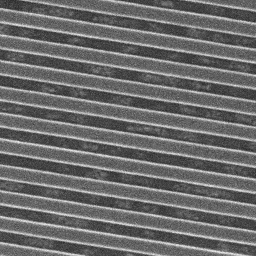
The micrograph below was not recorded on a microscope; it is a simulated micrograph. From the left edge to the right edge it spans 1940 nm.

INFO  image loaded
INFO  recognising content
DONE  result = parallel lines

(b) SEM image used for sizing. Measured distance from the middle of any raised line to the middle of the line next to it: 0.195 micrometres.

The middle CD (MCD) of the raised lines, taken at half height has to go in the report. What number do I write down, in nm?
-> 106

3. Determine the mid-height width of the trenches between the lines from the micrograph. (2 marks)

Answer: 11.3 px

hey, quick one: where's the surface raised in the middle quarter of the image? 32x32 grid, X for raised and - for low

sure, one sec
------------XXXXXXXXXXXXXXXXXXXX
------------------XXXXXXXXXXXXXX
XXXXX-------------------XXXXXXXX
XXXXXXXXXXXX------------------XX
XXXXXXXXXXXXXXXXXX--------------
--XXXXXXXXXXXXXXXXXXXXXX--------
---------XXXXXXXXXXXXXXXXXXXXX--
---------------XXXXXXXXXXXXXXXXX
XX------------------XXXXXXXXXXXX
XXXXXXXX--------------------XXXX
XXXXXXXXXXXXXX------------------
XXXXXXXXXXXXXXXXXXXX------------
-----XXXXXXXXXXXXXXXXXXXXXX-----
------------XXXXXXXXXXXXXXXXXXXX
------------------XXXXXXXXXXXXXX
XXXX--------------------XXXXXXXX
XXXXXXXXXX---------------------X
XXXXXXXXXXXXXXXXX---------------
--XXXXXXXXXXXXXXXXXXXXX---------
--------XXXXXXXXXXXXXXXXXXXXX---
--------------XXXXXXXXXXXXXXXXXX
XX-------------------XXXXXXXXXXX
XXXXXXXX-------------------XXXXX
XXXXXXXXXXXXXX------------------
XXXXXXXXXXXXXXXXXXXXX-----------
------XXXXXXXXXXXXXXXXXXXXX-----
-----------XXXXXXXXXXXXXXXXXXXXX
------------------XXXXXXXXXXXXXX
XXXX---------------------XXXXXXX
XXXXXXXXXXX--------------------X
XXXXXXXXXXXXXXXXX---------------
--XXXXXXXXXXXXXXXXXXXXX---------